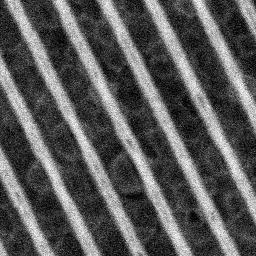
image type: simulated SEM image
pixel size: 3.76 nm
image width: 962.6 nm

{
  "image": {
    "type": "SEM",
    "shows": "parallel lines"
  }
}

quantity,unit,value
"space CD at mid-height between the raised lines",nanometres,118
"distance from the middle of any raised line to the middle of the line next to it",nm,155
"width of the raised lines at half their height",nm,36.1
